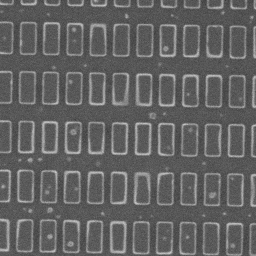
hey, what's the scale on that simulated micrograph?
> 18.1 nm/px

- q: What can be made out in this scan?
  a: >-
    groups of lines, slits or small figures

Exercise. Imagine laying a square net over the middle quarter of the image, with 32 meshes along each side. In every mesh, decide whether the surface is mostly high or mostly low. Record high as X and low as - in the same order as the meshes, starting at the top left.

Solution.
--------------------------------
--------------------------------
-XXX---XXX----------------------
-XXX---XXX--XXXX---XXX--XXX---XX
-XXX---XXX--XXXX---XXX--XXXX--XX
-XXX---XXX--XXXX---XXX--XXXX--XX
-XXX---XXX--XXXX---XXX--XXXX--XX
-XXX---XXX--XXX----XXX--XXX---XX
-XXX---XXX--XXX----XXX--XXX---XX
-XXX---XXX--XXX----XXX--XXX---XX
--------------------------------
--------------------------------
--------------------------------
--------------------------------
--------------------------------
-XXX--XXXX--XXXX--XXXX--XXX---XX
-XXX--XXXX--XXXX--XXXX--XXX---XX
XXXX--XXXX--XXXX--XXXX--XXX---XX
XXXX--XXXX--XXXX--XXX---XXX---XX
XXXX--XXXX--XXXX--XXX---XXX---XX
-XXX--XXXX--XXX---XXX---XXX---XX
-XXX---XXX--XXX---XXX---XXX---XX
------------------------XXX---XX
--------------------------------
--------------------------------
--------------------------------
--------------------------------
XXXX---XXX--XXX----------XX---XX
XXXX--XXXX--XXX---XXX---XXX--XXX
XXXX--XXXX--XXX---XXX---XXX--XXX
XXXX--XXXX--XXX---XXX--XXXX---XX
XXXX--XXXX--XXX---XXX--XXXX---XX